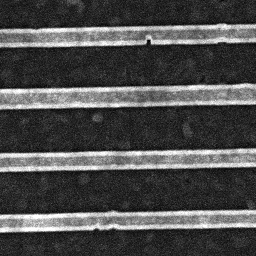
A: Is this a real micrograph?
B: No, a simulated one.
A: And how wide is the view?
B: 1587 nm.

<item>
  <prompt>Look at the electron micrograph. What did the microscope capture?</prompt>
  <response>one or a few lines or trenches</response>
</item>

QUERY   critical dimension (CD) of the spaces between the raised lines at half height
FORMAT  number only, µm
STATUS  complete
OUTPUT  0.292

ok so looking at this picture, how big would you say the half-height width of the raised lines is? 87.5 nm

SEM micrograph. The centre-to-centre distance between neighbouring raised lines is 0.382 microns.